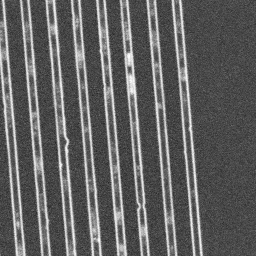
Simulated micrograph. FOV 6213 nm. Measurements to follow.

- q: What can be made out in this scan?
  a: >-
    parallel lines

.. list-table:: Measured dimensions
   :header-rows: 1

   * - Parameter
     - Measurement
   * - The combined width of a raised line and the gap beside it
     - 0.612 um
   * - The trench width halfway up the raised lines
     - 435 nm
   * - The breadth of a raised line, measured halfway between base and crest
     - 184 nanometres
